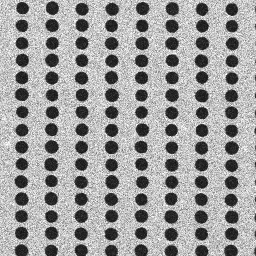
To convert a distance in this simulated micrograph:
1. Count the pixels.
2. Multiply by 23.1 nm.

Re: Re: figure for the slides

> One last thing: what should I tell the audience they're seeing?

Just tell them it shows a regular array of holes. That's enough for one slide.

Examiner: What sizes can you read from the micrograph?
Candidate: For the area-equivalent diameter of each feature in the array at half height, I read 13.1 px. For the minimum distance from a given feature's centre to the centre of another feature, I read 394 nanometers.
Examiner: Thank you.